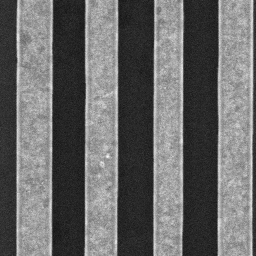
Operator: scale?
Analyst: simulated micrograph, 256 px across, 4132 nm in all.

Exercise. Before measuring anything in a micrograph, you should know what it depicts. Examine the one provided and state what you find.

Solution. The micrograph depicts wiring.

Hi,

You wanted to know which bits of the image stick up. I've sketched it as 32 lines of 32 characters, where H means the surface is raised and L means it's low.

LLHHHHHLLLLHHHHLLLLHHHHLLLLHHHHH
LLHHHHHLLLLHHHHLLLLHHHHLLLLHHHHH
LLHHHHHLLLLHHHHLLLLHHHHLLLLHHHHH
LLHHHHHLLLLHHHHLLLLHHHHLLLLHHHHH
LLHHHHHLLLLHHHHLLLLHHHHLLLLHHHHH
LLHHHHHLLLLHHHHLLLLHHHHLLLLHHHHH
LLHHHHHLLLLHHHHLLLLHHHHLLLLHHHHH
LLHHHHHLLLLHHHHLLLLHHHHLLLLHHHHH
LLHHHHHLLLLHHHHLLLLHHHHLLLLHHHHH
LLHHHHHLLLLHHHHLLLLHHHHLLLLHHHHH
LLHHHHHLLLLHHHHLLLLHHHHLLLLHHHHH
LLHHHHHLLLLHHHHLLLLHHHHLLLLHHHHH
LLHHHHLLLLLHHHHLLLLHHHHLLLLHHHHH
LLHHHHLLLLLHHHHLLLLHHHHLLLLHHHHH
LLHHHHLLLLLHHHHLLLLHHHHLLLLHHHHH
LLHHHHLLLLLHHHHLLLLHHHHLLLLHHHHH
LLHHHHLLLLLHHHHLLLLHHHHLLLLHHHHH
LLHHHHLLLLLHHHHLLLLHHHHLLLLHHHHL
LLHHHHLLLLLHHHHLLLLHHHHLLLLHHHHL
LLHHHHLLLLLHHHHLLLLHHHHLLLLHHHHL
LLHHHHLLLLLHHHHLLLLHHHHLLLLHHHHL
LLHHHHLLLLLHHHHLLLLHHHHLLLLHHHHL
LLHHHHLLLLLHHHHLLLLHHHHLLLLHHHHL
LLHHHHLLLLLHHHHLLLLHHHHLLLLHHHHL
LLHHHHLLLLLHHHHLLLLHHHHLLLLHHHHL
LLHHHHLLLLLHHHHLLLLHHHHLLLLHHHHL
LLHHHHLLLLLHHHHLLLLHHHHLLLLHHHHL
LLHHHHLLLLLHHHHLLLLHHHHLLLLHHHHL
LLHHHHLLLLLHHHHLLLLHHHHLLLLHHHHL
LLHHHHLLLLLHHHHLLLLHHHHLLLLHHHHL
LLHHHHLLLLLHHHHLLLLHHHHLLLLHHHHL
LLHHHHLLLLLHHHHLLLLHHHHLLLLHHHHL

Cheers